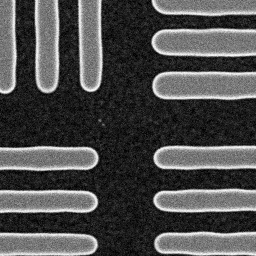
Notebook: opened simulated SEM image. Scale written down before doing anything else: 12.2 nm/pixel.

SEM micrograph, groups of lines, slits or small figures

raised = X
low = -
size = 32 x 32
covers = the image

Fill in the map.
XX---XX---XXX------XXXXXXXXXXXXX
XX--XXX---XX--------XXXXXXXXXXXX
XX--XXX---XX--------------------
XX---XX---XX--------------------
XX---XX---XXX------XXXXXXXXXXXXX
XX---XX---XXX------XXXXXXXXXXXXX
XX---XX---XXX-------XXXXXXXXXXXX
XX---XX---XXX-------------------
XX---XX---XXX-------------------
XX---XX---XXX-------XXXXXXXXXXXX
XX---XX---XX-------XXXXXXXXXXXXX
X------------------XXXXXXXXXXXXX
--------------------------------
--------------------------------
--------------------------------
--------------------------------
--------------------------------
--------------------------------
----XXX-------------XXXXX-XXXXXX
XXXXXXXXXXXX-------XXXXXXXXXXXXX
XXXXXXXXXXXX--------XXXXXXXXXXXX
--------------------------------
--------------------------------
--------------------------------
XXXXXXXXXXXX-------XXXXXXXXXXXXX
XXXXXXXXXXXX-------XXXXXXXXXXXXX
--------------------------------
--------------------------------
--------------------------------
XXXXXXXXXXX---------XXXXXXXXXXXX
XXXXXXXXXXXX-------XXXXXXXXXXXXX
XXXXXXXXXXXX--------XXXXXXXXXXXX